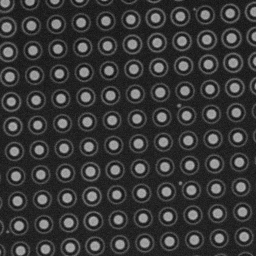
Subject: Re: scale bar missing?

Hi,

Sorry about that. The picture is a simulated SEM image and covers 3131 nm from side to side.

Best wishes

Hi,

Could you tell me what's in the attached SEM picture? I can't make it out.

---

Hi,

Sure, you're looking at an array of small figures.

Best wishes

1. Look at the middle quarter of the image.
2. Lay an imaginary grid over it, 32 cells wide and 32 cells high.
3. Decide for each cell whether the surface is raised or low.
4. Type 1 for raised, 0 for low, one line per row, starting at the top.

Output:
11110011110001110001110000110000
01100001100001100000110000110000
01100001100001110001110001111001
01100001110011111111111111111111
11111111111111111111111111111111
11111111111111111011111001111000
11110001110001110000110000110000
01100001110000110000110000110000
01100000110000110000110000111000
01110001110001111001111111111111
11111111111111111111111111111111
11111111111111111111111000111000
11111011111001111000110000111000
01110000110000110000110000011000
00110000110000110000111000111000
00110000110000111001111111111111
01111011111111111111111111111111
11111111111111111111111111111100
11111111111000111000111000011000
01110000110000111000011000011000
00110000110000011000011000011000
00110000111000111000111100111111
00111001111111111111111111111111
11111111111111111111111111111100
11111111111101111100111100011000
00111000111000011000011000011000
00111000011000011000011000011100
00011000011000011000011100111110
00111000111100111111111111111111
01111111111111111111111111111111
11111111111111111100111100011100
01111100111000011000011000001100